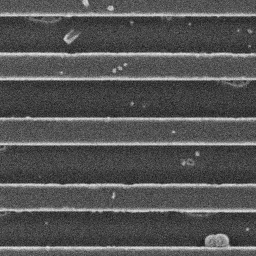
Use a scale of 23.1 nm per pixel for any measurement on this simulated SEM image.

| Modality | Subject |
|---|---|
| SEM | lines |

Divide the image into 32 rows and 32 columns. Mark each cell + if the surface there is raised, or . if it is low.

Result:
++++++++++++++++++++++++++++++++
++++++++++++++++++++++++++++++++
................................
................................
................................
................................
................................
++++++++++++++++++++++++++++++++
++++++++++++++++++++++++++++++++
++++++++++++++++++++++++++++++++
................................
................................
................................
................................
................................
++++++++++++++++++++++++++++++++
++++++++++++++++++++++++++++++++
++++++++++++++++++++++++++++++++
................................
................................
................................
................................
................................
++++++++++++++++++++++++++++++++
++++++++++++++++++++++++++++++++
++++++++++++++++++++++++++++++++
................................
................................
................................
................................
..........................++....
++++++++++++++++++++++++++++++++